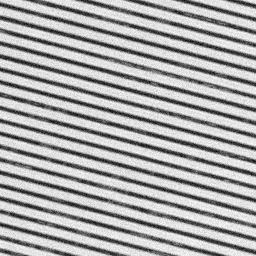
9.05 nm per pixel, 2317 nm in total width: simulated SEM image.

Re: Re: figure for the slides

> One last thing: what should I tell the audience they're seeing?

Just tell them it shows parallel lines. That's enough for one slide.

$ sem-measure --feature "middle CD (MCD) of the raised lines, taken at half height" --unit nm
62.4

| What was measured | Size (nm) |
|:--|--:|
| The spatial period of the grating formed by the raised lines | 113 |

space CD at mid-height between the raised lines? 53.7 nm